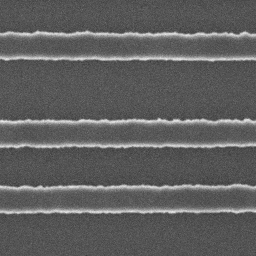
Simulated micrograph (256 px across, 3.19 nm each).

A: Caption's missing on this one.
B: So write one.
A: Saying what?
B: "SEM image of lines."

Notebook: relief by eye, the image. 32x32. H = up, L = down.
LLLLLLLLLLLLLLLLLLLLLLLLLLLLLLLL
LLLLLLLLLLLLLLLLLLLLLLLLLLLLLLLL
LLLLLLLLLLLLLLLLLLLLLLLLLLLLLLLL
LLLLLLLLLLLLLLLLLLLLLLLLLLLLLLLL
HHHHHHHHHHHHHHHHHHHHHHHHHHHHHHHH
HHHHHHHHHHHHHHHHHHHHHHHHHHHHHHHH
HHHHHHHHHHHHHHHHHHHHHHHHHHHHHHHH
LLLLLLLLLLLLLLLLLLLLLLLLLLHLLLLL
LLLLLLLLLLLLLLLLLLLLLLLLLLLLLLLL
LLLLLLLLLLLLLLLLLLLLLLLLLLLLLLLL
LLLLLLLLLLLLLLLLLLLLLLLLLLLLLLLL
LLLLLLLLLLLLLLLLLLLLLLLLLLLLLLLL
LLLLLLLLLLLLLLLLLLLLLLLLLLLLLLLL
LLLLLLLLLLLLLLLLLLLLLLLLLLLLLLLL
LLLLLLLLLLLLLLLLLLLLLLLLLLLLLLLL
HHHHHHHHHHHHHHHHHHHHHHHHHHHHHHHH
HHHHHHHHHHHHHHHHHHHHHHHHHHHHHHHH
HHHHHHHHHHHHHHHHHHHHHHHHHHHHHHHH
LLLLLLLLLLLLLLLLLLLLLLLLLLLLLLLL
LLLLLLLLLLLLLLLLLLLLLLLLLLLLLLLL
LLLLLLLLLLLLLLLLLLLLLLLLLLLLLLLL
LLLLLLLLLLLLLLLLLLLLLLLLLLLLLLLL
LLLLLLLLLLLLLLLLLLLLLLLLLLLLLLLL
HHHHHHHHHHHHHHHHHHHHHHHHHHHHHHHH
HHHHHHHHHHHHHHHHHHHHHHHHHHHHHHHH
HHHHHHHHHHHHHHHHHHHHHHHHHHHHHHHH
HHHHHHHHHHHHHHHHLHHLLHLLHLLLLHLL
LLLLLLLLLLLLLLLLLLLLLLLLLLLLLLLL
LLLLLLLLLLLLLLLLLLLLLLLLLLLLLLLL
LLLLLLLLLLLLLLLLLLLLLLLLLLLLLLLL
LLLLLLLLLLLLLLLLLLLLLLLLLLLLLLLL
LLLLLLLLLLLLLLLLLLLLLLLLLLLLLLLL